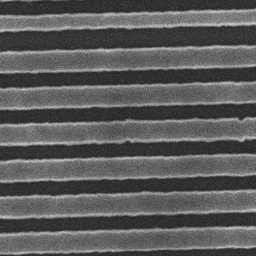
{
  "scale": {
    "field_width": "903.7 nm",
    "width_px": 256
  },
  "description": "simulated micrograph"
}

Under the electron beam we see parallel lines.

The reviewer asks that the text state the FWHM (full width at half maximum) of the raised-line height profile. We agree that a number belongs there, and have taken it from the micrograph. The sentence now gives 72.8 nm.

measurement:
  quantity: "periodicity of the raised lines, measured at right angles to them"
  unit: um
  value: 0.13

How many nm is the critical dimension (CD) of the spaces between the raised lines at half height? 56.5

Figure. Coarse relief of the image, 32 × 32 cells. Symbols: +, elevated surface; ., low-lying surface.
................................
........................++++++++
++++++++++++++++++++++++++++++++
++++++++++++....................
................................
................................
....++++++++++++++++++++++++++++
++++++++++++++++++++++++++++++++
+++++++++++++++++++++..++.......
................................
........................++++++++
++++++++++++++++++++++++++++++++
++++++++++++++++++++++++++++++++
+++++...........................
................................
.....+++++++++++++++++++++++++++
++++++++++++++++++++++++++++++++
++++++++++++++++++++++..++....+.
................................
.......................++.++++++
++++++++++++++++++++++++++++++++
++++++++++++++++++++++++++++++++
++++++++........................
................................
........++++++++++++++++++++++++
++++++++++++++++++++++++++++++++
+++++++++++++++++++++++++++.....
................................
...........................+++++
++++++++++++++++++++++++++++++++
++++++++++++++++++++++++++++++++
+++++++++.+.....................